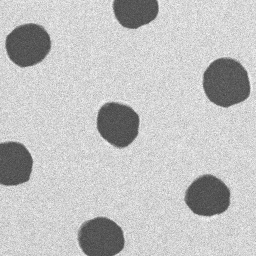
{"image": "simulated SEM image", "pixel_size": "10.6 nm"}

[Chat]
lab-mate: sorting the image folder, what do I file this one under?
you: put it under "holes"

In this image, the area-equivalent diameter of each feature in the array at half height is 467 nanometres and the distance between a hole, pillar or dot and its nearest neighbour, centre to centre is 1220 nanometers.